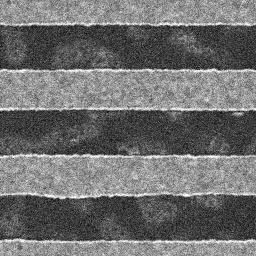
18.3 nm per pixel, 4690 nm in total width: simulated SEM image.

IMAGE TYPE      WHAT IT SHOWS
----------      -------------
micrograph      one or a few lines or trenches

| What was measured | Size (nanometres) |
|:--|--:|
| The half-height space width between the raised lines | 840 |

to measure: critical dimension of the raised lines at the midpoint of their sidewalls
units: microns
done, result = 0.712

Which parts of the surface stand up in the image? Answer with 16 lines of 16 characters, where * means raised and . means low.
****************
****************
................
................
****************
****************
****************
................
................
................
****************
****************
................
................
................
****************